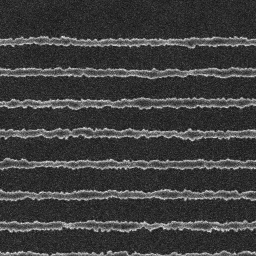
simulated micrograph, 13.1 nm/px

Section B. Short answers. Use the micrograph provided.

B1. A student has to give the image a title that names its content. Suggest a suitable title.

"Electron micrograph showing parallel lines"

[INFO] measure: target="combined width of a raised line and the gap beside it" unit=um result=0.401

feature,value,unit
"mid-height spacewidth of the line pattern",309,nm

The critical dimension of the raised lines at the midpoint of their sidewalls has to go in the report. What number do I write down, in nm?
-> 91.6